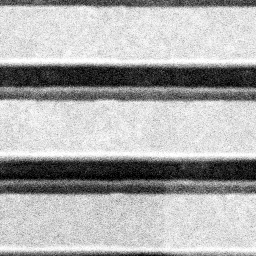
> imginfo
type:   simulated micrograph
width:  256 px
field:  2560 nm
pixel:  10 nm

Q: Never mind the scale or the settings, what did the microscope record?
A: lines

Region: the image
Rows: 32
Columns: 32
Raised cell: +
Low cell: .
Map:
..+++.............+++...........
++++++++++++++++++++++++++++++++
++++++++++++++++++++++++++++++++
++++++++++++++++++++++++++++++++
++++++++++++++++++++++++++++++++
++++++++++++++++++++++++++++++++
++++++++++++++++++++++++++++++++
++++++++++++++++++++++++++++++++
................................
................................
................................
.................+..............
..................+.............
++++++++++++++++++++++++++++++++
++++++++++++++++++++++++++++++++
++++++++++++++++++++++++++++++++
++++++++++++++++++++++++++++++++
++++++++++++++++++++++++++++++++
++++++++++++++++++++++++++++++++
....+++...........++++++++++++++
................................
................................
................................
................................
++++++++++++++++++++++++++++++++
++++++++++++++++++++++++++++++++
++++++++++++++++++++++++++++++++
++++++++++++++++++++++++++++++++
++++++++++++++++++++++++++++++++
++++++++++++++++++++++++++++++++
++++++++++++++++++++++++++++++++
................................